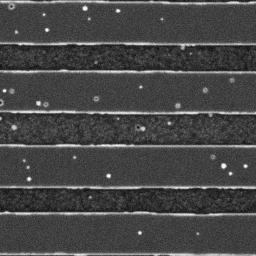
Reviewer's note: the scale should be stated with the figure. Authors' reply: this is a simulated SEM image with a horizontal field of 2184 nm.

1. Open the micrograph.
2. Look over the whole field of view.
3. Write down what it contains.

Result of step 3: lines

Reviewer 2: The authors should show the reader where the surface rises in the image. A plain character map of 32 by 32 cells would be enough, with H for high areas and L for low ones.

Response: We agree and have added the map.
HHHHHHHHHHHHHHHHHHHHHHHHHHHHHHHH
HHHHHHHHHHHHHHHHHHHHHHHHHHHHHHHH
HHHHHHHHHHHHHHHHHHHHHHHHHHHHHHHH
HHHHHHHHHHHHHHHHHHHHHHHHHHHHHHHH
HHHHHHHHHHHHHHHHHHHHHHHHHHHHHHHH
LLHHHHHHHHHHLLLHHHHHHHHHHHHHHHHH
LLLLLLLLLLLLLLLLLLLLLLLLLLLLLLLL
LLLLLLLLLLLLLLLLLLLLLLLLLLLLLLLL
LLLLLLLLLLLLLLLLLLLLLLLLLLLLLLLL
HHHHHHHHHHHHHHHHHHHHHHHHHHHHHHHH
HHHHHHHHHHHHHHHHHHHHHHHHHHHHHHHH
HHHHHHHHHHHHHHHHHHHHHHHHHHHHHHHH
HHHHHHHHHHHHHHHHHHHHHHHHHHHHHHHH
HHHHHHHHHHHHHHHHHHHHHHHHHHHHHHHH
LLLLLLLLLLLLLLLLLLLLLLLLLLLLLLLL
LLLLLLLLLLLLLLLLLLLLLLLLLLLLLLLL
LLLLLLLLLLLLLLLLLLLLLLLLLLLLLLLL
LLLLLLLLLLLLLLLLLLLLLLLLLLLLLLLL
HHHHHHHHHHHHHHHHHHHHHHHHHHHHHHHH
HHHHHHHHHHHHHHHHHHHHHHHHHHHHHHHH
HHHHHHHHHHHHHHHHHHHHHHHHHHHHHHHH
HHHHHHHHHHHHHHHHHHHHHHHHHHHHHHHH
HHHHHHHHHHHHHHHHHHHHHHHHHHHHHHHH
LLLHLLLLLHHHHHHHHHLLLHHHLHLHHHHH
LLLLLLLLLLLLLLLLLLLLLLLLLLLLLLLL
LLLLLLLLLLLLLLLLLLLLLLLLLLLLLLLL
LLLLLLLLLLLLLLLLLLLLLLLLLLLLLLLL
HHHHHHHHHHHHHHHHHHHHHHHHHHHHHHHH
HHHHHHHHHHHHHHHHHHHHHHHHHHHHHHHH
HHHHHHHHHHHHHHHHHHHHHHHHHHHHHHHH
HHHHHHHHHHHHHHHHHHHHHHHHHHHHHHHH
HHHHHHHHHHHHHHHHHHHHHHHHHHHHHHHH